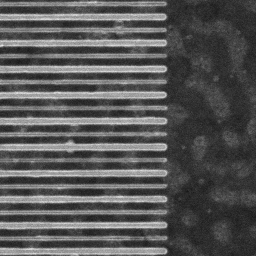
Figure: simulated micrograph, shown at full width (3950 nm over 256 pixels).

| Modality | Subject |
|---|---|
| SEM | parallel lines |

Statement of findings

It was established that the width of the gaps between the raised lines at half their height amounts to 57.8 nm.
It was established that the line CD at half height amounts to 158 nm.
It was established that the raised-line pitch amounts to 201 nm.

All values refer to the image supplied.